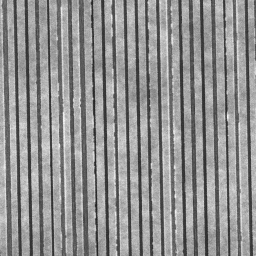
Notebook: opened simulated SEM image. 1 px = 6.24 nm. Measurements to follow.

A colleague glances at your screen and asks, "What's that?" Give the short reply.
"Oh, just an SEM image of parallel lines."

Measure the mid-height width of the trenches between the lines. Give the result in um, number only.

0.0218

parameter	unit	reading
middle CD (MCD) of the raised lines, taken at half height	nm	42.9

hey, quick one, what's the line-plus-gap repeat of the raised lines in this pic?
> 68.3 nanometers